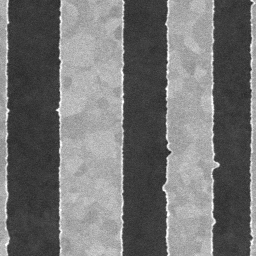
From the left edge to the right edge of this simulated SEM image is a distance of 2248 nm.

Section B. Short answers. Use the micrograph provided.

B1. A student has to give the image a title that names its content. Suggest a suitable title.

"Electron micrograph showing one or a few lines or trenches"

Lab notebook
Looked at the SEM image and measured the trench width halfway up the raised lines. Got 393 nanometers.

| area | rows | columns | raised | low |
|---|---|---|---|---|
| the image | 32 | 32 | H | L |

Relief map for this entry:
HLLLLLLLHHHHHHHLLLLLLHHHHHHLLLLL
HLLLLLLLHHHHHHHLLLLLLHHHHHHLLLLH
HLLLLLLLHHHHHHHLLLLLLHHHHHHLLLLH
HLLLLLLLHHHHHHHLLLLLLHHHHHHLLLLH
HLLLLLLLHHHHHHHLLLLLLHHHHHHLLLLH
HLLLLLLLHHHHHHHLLLLLLHHHHHHLLLLH
HLLLLLLLHHHHHHHLLLLLLHHHHHLLLLLH
HLLLLLLLHHHHHHHLLLLLLHHHHHHLLLLH
HLLLLLLLHHHHHHHLLLLLLHHHHHLLLLLH
HLLLLLLLHHHHHHHLLLLLLHHHHHHLLLLH
HLLLLLLLHHHHHHHLLLLLLHHHHHHLLLLH
HLLLLLLLHHHHHHHLLLLLLHHHHHLLLLLH
HLLLLLLLHHHHHHHLLLLLLHHHHHHLLLLH
HLLLLLLHHHHHHHHLLLLLLHHHHHHLLLLH
HLLLLLLHHHHHHHHLLLLLLHHHHHHLLLLH
HLLLLLLLHHHHHHHLLLLLLHHHHHHLLLLH
HLLLLLLHHHHHHHHLLLLLLHHHHHHLLLLH
HLLLLLLLHHHHHHHLLLLLLHHHHHHLLLLH
HLLLLLLHHHHHHHHLLLLLLHHHHHHLLLLH
HLLLLLLLHHHHHHHLLLLLLHHHHHHLLLLH
HLLLLLLHHHHHHHHLLLLLLHHHHHHLLLLH
HLLLLLLHHHHHHHHLLLLLLHHHHHHLLLLH
HLLLLLLHHHHHHHHLLLLLLHHHHHHLLLLH
HLLLLLLHHHHHHHHLLLLLHHHHHHHLLLLH
HLLLLLLLHHHHHHHLLLLLLHHHHHHLLLLH
HLLLLLLLHHHHHHHLLLLLLHHHHHHLLLLH
HLLLLLLHHHHHHHHLLLLLLHHHHHHLLLLH
HLLLLLLLHHHHHHHLLLLLLHHHHHHLLLLH
HLLLLLLLHHHHHHHLLLLLLHHHHHHLLLLH
HLLLLLLLHHHHHHHLLLLLLHHHHHHLLLLL
HLLLLLLLHHHHHHHLLLLLLHHHHHLLLLLH
HLLLLLLLHHHHHHHLLLLLLHHHHHHLLLLH